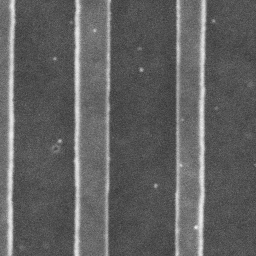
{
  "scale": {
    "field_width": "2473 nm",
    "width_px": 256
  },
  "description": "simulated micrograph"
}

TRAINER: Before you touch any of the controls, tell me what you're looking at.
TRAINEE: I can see lines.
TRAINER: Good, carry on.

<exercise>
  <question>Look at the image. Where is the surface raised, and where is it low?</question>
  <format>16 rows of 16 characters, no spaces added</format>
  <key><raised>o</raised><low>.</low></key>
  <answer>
o....oo....oo...
o....oo....oo...
o....oo....oo...
o....oo....oo...
o....oo....oo...
o....oo....oo...
o....oo....oo...
o....oo....oo...
o....oo....oo...
o....oo....oo...
o....oo....oo...
o....oo....oo...
o....oo....oo...
o....oo....oo...
o....oo....oo...
o....oo....oo...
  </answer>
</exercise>